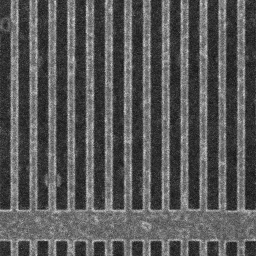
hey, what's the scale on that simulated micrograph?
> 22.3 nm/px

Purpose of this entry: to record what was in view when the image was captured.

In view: parallel lines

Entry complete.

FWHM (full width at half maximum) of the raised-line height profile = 142 nanometers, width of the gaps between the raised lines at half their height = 0.271 µm